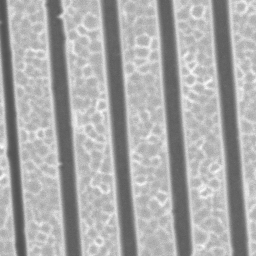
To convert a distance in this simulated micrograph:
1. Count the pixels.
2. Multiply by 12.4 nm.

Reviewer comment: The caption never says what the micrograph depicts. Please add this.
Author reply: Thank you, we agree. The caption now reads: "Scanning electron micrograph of parallel lines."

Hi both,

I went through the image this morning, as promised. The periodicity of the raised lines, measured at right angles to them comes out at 683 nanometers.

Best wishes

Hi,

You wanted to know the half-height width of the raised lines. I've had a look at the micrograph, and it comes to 0.493 microns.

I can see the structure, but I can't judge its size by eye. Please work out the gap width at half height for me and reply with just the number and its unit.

186 nm